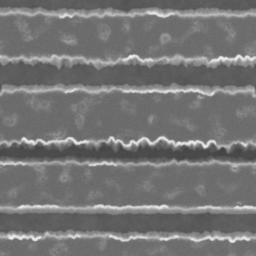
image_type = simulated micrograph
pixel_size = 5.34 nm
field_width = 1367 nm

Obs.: one or a few lines or trenches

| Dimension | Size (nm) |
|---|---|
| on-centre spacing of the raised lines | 397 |